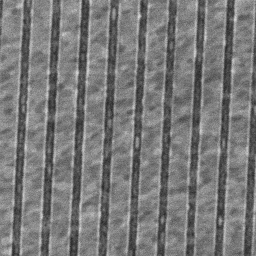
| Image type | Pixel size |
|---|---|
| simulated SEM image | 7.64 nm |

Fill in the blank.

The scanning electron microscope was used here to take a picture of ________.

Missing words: parallel lines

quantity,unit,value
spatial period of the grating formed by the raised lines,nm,222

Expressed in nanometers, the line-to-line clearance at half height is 73.5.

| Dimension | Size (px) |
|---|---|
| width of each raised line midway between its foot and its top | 19.2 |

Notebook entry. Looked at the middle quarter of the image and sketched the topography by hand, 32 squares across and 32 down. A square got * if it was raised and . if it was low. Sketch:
***...*****..*****...****...****
***...*****..*****..*****...****
***...****...*****..*****...****
***...*****..*****..*****...****
***...****...*****..*****...****
***...****...*****..*****...****
***...****...*****..*****..*****
***..*****...*****..*****..*****
***..*****...*****..*****..*****
***..*****...****...****...*****
***..*****...****...*****..*****
***..*****...****...*****..*****
***..*****...****...*****..*****
***..*****...****...****...*****
***..*****...****...****...*****
***..*****...****...****...*****
***..*****...****...****...*****
***..*****..*****...****...*****
**...*****..*****...****...*****
**...*****..*****.*.****...****.
**...*****..*****...****...****.
**...*****..*****..*****...****.
**...*****..*****..*****...****.
**...*****..*****..*****...****.
**...****...*****..*****..*****.
**...****...*****..*****...****.
**...****...*****..*****..*****.
**...****...*****..*****..*****.
**..*****...*****..*****..*****.
**..*****...****...*****..*****.
**...****...****...*****..*****.
**...****...****...*****..*****.